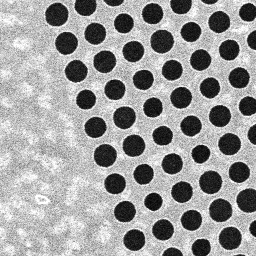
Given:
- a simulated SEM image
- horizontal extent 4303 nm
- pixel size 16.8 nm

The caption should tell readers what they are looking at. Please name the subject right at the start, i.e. a regular array of holes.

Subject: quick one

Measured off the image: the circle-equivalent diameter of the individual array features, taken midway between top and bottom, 370 nanometres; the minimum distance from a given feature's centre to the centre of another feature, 498 nm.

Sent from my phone